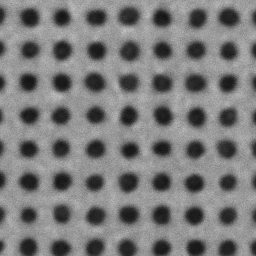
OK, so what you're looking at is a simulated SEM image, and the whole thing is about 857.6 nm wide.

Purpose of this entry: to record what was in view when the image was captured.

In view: a regular array of holes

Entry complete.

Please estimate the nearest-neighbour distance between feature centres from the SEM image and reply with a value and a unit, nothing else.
108 nm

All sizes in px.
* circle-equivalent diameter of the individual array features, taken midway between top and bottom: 18.4